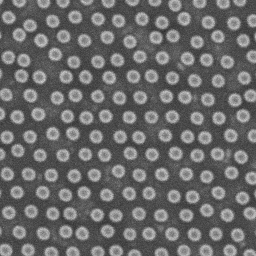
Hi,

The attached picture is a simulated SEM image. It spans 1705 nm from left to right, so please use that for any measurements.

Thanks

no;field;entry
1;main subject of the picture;a regular array of raised bodies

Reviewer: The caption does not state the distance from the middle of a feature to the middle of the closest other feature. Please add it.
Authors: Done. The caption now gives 19.3 px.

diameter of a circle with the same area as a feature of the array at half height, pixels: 11.9